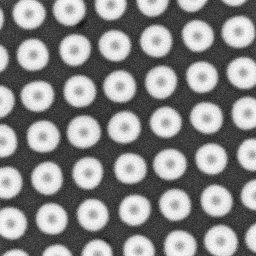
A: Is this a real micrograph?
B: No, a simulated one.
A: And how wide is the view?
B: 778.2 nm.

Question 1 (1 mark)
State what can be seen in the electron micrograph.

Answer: an array of small figures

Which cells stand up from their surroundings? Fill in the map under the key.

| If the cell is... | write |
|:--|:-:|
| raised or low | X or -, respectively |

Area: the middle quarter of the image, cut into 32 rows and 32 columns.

--------------------------------
----------------------XXXXX----X
------------XXXX-----XXXXXXX---X
--XXXX-----XXXXXX----XXXXXXX---X
-XXXXXX---XXXXXXXX--XXXXXXXX---X
XXXXXXXX--XXXXXXXX---XXXXXXX----
XXXXXXXX--XXXXXXXX---XXXXXX-----
XXXXXXXX---XXXXXX-----XXXXX-----
XXXXXXXX---XXXXXX-------X-------
-XXXXXX-------------------------
--XXX---------------------------
-----------------------XXXX-----
-------------XXXX-----XXXXXX----
---XXXX-----XXXXXX----XXXXXXX---
--XXXXXX---XXXXXXXX---XXXXXXX---
-XXXXXXXX--XXXXXXXX---XXXXXXX---
-XXXXXXXX--XXXXXXXX---XXXXXXX---
-XXXXXXXX--XXXXXXXX----XXXXX----
-XXXXXXXX---XXXXXX--------------
--XXXXXX------XX----------------
---XXXX-------------------------
--------------------------XX----
------------------------XXXXX---
--------------XXXXX----XXXXXXX--
----XXXXX----XXXXXXX--XXXXXXXX--
---XXXXXX----XXXXXXX---XXXXXXX--
--XXXXXXX----XXXXXXX---XXXXXXX--
--XXXXXXX----XXXXXXX---XXXXXXX--
--XXXXXXX-----XXXXXX-----XXX----
---XXXXXX------XXX--------------
----XXXX------------------------
----------------------------X---